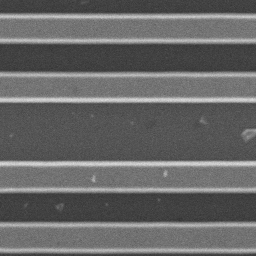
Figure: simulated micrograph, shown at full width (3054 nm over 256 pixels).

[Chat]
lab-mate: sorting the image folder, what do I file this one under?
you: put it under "groups of lines, slits or small figures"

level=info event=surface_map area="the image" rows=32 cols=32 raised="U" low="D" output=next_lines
DDDDDDDDDDDDDDDDDDDDDDDDDDDDDDDD
DDDDDDDDDDDDDDDDDDDDDDDDDDDDDDDD
UUUUUUUUUUUUUUUUUUUUUUUUUUUUUUUU
UUUUUUUUUUUUUUUUUUUUUUUUUUUUUUUU
UUUUUUUUUUUUUUUUUUUUUUUUUUUUUUUU
DDDDDDDDDDDDDDDDDDDDDDDDDDDDDDDD
DDDDDDDDDDDDDDDDDDDDDDDDDDDDDDDD
DDDDDDDDDDDDDDDDDDDDDDDDDDDDDDDD
DDDDDDDDDDDDDDDDDDDDDDDDDDDDDDDD
UUUUUUUUUUUUUUUUUUUUUUUUUUUUUUUU
UUUUUUUUUUUUUUUUUUUUUUUUUUUUUUUU
UUUUUUUUUUUUUUUUUUUUUUUUUUUUUUUU
DDDDDDDDUUUUDDUDUUUDDDUUUUUDDDDD
DDDDDDDDDDDDDDDDDDDDDDDDDDDDDDDD
DDDDDDDDDDDDDDDDDDDDDDDDDDDDDDDD
DDDDDDDDDDDDDDDDDDDDDDDDDDDDDDDD
DDDDDDDDDDDDDDDDDDDDDDDDDDDDDDDD
DDDDDDDDDDDDDDDDDDDDDDDDDDDDDDDD
DDDDDDDDDDDDDDDDDDDDDDDDDDDDDDDD
DDDDDDDDDDDDDDDDDDDDDDDDDDDDDDDD
UUUUUUUUUUUUUUUUUUUUUUUUUUUUUUUU
UUUUUUUUUUUUUUUUUUUUUUUUUUUUUUUU
UUUUUUUUUUUUUUUUUUUUUUUUUUUUUUUU
UUUUUUUUUUUUUUUUUUUUUUUUUUUUUUUU
DDDDDDDDDDDDDDDDDDDDDDDDDDDDDDDD
DDDDDDDDDDDDDDDDDDDDDDDDDDDDDDDD
DDDDDDDDDDDDDDDDDDDDDDDDDDDDDDDD
DDDDDDDDDDDDDDDDDDDDDDDDDDDDDDDD
UUUUUUUUUUUUUUUUUUUUUUUUUUUUUUUU
UUUUUUUUUUUUUUUUUUUUUUUUUUUUUUUU
UUUUUUUUUUUUUUUUUUUUUUUUUUUUUUUU
DDDDDDDDDDDDDDDDDDDDDDDDDDDDDDDD